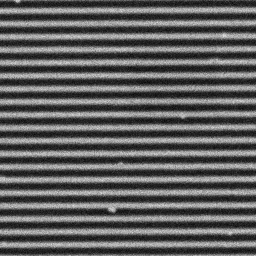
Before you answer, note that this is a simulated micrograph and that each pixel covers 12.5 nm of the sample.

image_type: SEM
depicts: parallel lines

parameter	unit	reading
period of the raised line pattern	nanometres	163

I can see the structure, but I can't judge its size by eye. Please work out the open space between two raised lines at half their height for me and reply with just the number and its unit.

0.105 um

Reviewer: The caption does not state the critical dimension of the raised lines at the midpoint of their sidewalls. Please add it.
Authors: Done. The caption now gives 62.5 nanometres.